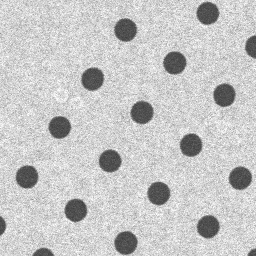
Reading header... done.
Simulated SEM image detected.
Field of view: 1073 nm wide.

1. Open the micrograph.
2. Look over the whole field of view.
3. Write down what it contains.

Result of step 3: a regular array of holes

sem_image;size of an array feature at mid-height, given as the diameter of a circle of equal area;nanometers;94.7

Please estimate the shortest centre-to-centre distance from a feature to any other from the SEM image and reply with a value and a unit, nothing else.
245 nm